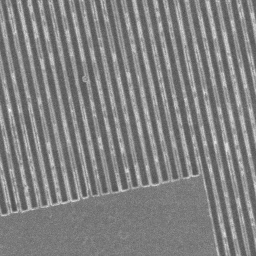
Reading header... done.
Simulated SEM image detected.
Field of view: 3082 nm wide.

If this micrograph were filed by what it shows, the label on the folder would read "parallel lines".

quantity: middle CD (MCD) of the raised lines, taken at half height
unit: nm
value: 41.3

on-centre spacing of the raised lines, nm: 123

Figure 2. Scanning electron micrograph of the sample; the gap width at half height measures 0.0811 µm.